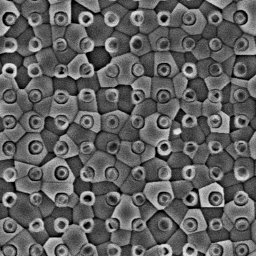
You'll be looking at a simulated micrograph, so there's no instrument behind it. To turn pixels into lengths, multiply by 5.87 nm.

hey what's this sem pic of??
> a regular array of raised bodies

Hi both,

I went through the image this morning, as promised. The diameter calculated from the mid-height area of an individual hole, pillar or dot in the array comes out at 66.5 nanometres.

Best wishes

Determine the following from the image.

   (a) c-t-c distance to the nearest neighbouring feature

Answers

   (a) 82.6 nanometres